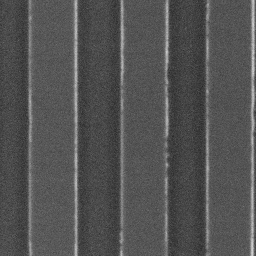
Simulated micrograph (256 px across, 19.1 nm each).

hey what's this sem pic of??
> lines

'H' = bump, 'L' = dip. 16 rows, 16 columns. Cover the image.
LLHHHLLLHHLLLHHH
LLHHHLLLHHLLLHHH
LLHHHLLLHHLLLHHH
LLHHHLLLHHLLLHHH
LLHHHLLLHHLLLHHH
LLHHHLLLHHLLLHHH
LLHHHLLLHHLLLHHH
LLHHHLLLHHLLLHHH
LLHHHLLLHHLLLHHH
LLHHHLLLHHLLLHHH
LLHHHLLLHHLLLHHH
LLHHHLLLHHLLLHHH
LLHHHLLLHHLLLHHH
LLHHHLLLHHLLLHHH
LLHHHLLLHHLLLHHH
LLHHHLLLHHLLLHHH